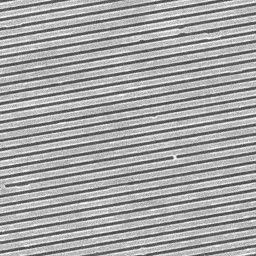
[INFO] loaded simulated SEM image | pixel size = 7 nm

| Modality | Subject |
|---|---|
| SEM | parallel lines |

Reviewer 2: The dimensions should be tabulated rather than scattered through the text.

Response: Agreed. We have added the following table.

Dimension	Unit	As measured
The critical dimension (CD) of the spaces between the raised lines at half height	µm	0.0242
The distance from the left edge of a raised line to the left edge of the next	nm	64.2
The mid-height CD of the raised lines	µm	0.0423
